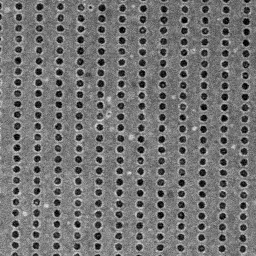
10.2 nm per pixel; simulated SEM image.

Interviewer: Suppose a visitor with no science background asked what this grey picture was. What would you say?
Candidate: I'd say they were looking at a regular array of holes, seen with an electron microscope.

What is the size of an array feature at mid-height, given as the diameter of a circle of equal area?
75.4 nanometers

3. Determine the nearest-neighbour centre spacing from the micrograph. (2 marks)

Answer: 109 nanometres